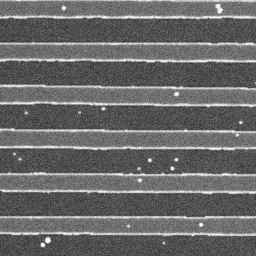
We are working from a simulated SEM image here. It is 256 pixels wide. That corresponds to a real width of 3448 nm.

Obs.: lines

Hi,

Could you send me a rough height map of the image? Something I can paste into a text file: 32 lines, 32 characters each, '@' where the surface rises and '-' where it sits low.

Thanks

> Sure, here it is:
@@@@@@@@@@@@@@@@@@@@@@@@@@@@@@@@
@@@@@@@@@@@@@@@@@@@@@@@@@@@@@@@@
--------------------------------
--------------------------------
--------------------------------
@@@@@@@@@@@@@@@@@@@@@@@@@@@@@@@@
@@@@@@@@@@@@@@@@@@@@@@@@@@@@@@@@
@------@@--@@@@@@@@@@@@@@@@@@@@@
--------------------------------
--------------------------------
--------------------------------
@@@@@@@@@@@@@@@@@@@@@@@@@@@@@@@@
@@@@@@@@@@@@@@@@@@@@@@@@@@@@@@@@
--------------------------------
--------------------------------
--------------------------------
@@@@@@@@@@@@@@@@@@@@@@@@@@@@@@--
@@@@@@@@@@@@@@@@@@@@@@@@@@@@@@@@
---------@@@@@@@@@@@@@@@@@@@@@@@
--------------------------------
--------------------------------
--------------------------------
@@@@@@@@@@@@@@@@@@@@@@@@@@@@@@@@
@@@@@@@@@@@@@@@@@@@@@@@@@@@@@@@@
--------------------------------
--------------------------------
--------------------------------
@@@@@@@@@@@@@@@@@@@@@@@@@@@@@@@@
@@@@@@@@@@@@@@@@@@@@@@@@@@@@@@@@
--------------------------------
--------------------------------
--------------------------------